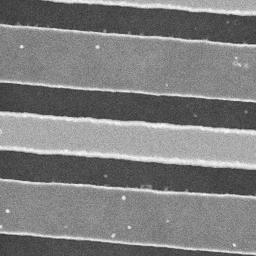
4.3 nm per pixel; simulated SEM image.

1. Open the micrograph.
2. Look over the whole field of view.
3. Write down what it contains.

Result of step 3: lines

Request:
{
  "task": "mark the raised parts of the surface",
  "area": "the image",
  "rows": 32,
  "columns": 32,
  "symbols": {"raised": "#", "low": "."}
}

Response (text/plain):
.............###################
..........................######
................................
######..........................
##################..............
#############################...
################################
################################
################################
################################
..##############################
................################
............................####
................................
#######.........................
#####################...........
################################
################################
################################
...........#####################
.......................#########
................................
##..............................
###############.................
################################
################################
################################
################################
################################
....############################
................################
............................####